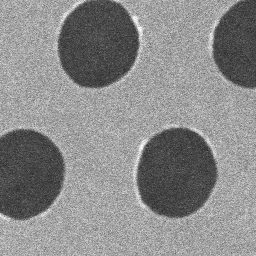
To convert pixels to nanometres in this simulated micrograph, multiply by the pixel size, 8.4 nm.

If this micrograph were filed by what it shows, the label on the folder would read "holes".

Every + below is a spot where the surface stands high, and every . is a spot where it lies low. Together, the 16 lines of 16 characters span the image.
+++++...++++++..
++++....++++++..
++++.....++++...
++++.....++++...
++++....++++++..
+++++.+++++++++.
++++++++++++++++
++++++++++++++++
...+++++++...+++
....+++++....+++
....+++++.....++
....+++++....+++
...++++++....+++
..++++++++..++++
++++++++++++++++
++++++++++++++++